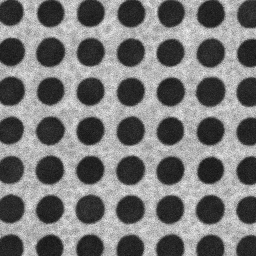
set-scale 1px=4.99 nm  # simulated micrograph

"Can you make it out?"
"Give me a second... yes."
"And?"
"a regular array of holes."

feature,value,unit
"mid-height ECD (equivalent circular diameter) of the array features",0.141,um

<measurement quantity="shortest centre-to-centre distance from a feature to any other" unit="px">39.2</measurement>